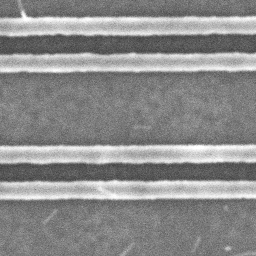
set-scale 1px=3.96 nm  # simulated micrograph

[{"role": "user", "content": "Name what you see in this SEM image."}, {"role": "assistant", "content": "lines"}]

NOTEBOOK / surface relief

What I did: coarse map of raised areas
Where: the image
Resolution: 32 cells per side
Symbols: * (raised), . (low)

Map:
................................
................................
********************************
********************************
................................
................................
................................
********************************
********************************
................................
................................
................................
................................
................................
................................
................................
................................
................................
********************************
********************************
................................
................................
................................
********************************
********************************
................................
................................
................................
................................
................................
................................
................................